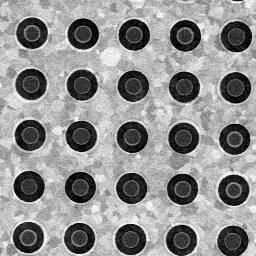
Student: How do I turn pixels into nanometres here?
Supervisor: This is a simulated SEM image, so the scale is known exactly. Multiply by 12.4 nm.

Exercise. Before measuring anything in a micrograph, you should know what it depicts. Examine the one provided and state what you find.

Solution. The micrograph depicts an array of small figures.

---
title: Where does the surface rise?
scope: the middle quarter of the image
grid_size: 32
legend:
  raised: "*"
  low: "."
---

********************************
***...**************************
*.......*******.....********....
*...**..******.......******.....
*..***...****...***..*****...***
...***...****...***..*****..****
*..***..*****...***..*****..****
*.......******.......*****...**.
**.....*******......*******.....
****************...*********....
********************************
********************************
********************************
********************************
***...*********....**********..*
*.......******......*******.....
*..**...*****........*****......
..****...****..****..*****..****
..****...****..****..*****..****
*..***..*****...***..*****..****
*.......******.......*****......
**.....*******.....********.....
*****************************..*
********************************
********************************
********************************
********************************
**....*********...**********...*
*.......******......*******.....
...***..*****...**..******......
..****..*****..****..*****..***.
..****..*****..****..*****..****